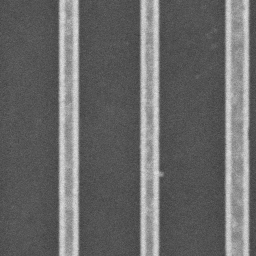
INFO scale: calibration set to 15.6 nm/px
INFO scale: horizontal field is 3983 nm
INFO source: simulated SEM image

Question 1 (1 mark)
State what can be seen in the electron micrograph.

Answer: one or a few lines or trenches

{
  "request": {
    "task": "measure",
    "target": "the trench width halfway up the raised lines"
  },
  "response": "1070 nanometres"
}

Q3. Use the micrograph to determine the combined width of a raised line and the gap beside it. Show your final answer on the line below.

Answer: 1310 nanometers